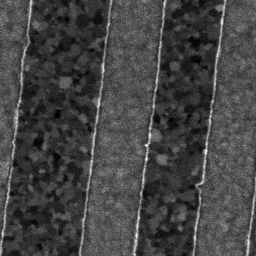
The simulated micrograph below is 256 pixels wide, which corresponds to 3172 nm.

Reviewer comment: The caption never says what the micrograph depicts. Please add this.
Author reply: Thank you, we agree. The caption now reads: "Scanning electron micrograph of one or a few lines or trenches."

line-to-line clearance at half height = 656 nanometers